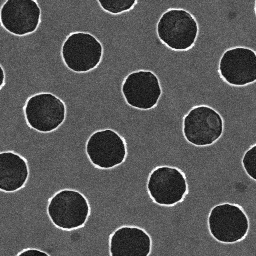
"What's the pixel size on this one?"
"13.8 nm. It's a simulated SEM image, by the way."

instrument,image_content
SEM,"a regular array of holes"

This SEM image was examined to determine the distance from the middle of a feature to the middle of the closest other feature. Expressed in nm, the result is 967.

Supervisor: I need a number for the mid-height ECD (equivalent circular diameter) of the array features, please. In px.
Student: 38.8